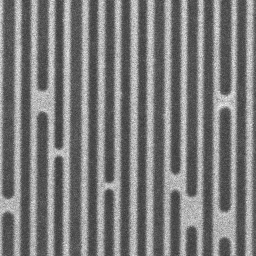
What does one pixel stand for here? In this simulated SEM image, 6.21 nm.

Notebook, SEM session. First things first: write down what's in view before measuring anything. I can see parallel lines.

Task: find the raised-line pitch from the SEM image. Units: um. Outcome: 0.103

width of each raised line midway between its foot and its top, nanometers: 45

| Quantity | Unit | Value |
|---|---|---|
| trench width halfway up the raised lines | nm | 61.3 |